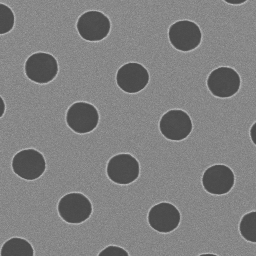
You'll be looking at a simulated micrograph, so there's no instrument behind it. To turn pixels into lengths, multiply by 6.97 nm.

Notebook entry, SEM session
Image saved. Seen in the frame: a regular array of holes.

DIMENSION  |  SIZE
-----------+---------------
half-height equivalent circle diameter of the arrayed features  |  216 nanometers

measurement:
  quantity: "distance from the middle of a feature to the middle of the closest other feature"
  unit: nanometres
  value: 444